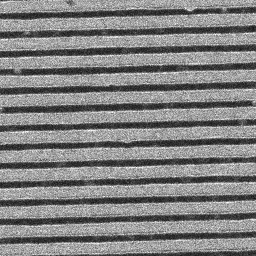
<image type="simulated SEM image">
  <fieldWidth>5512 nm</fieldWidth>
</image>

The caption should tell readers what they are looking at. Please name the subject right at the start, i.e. parallel lines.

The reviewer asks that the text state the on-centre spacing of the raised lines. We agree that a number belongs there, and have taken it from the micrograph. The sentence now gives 403 nanometers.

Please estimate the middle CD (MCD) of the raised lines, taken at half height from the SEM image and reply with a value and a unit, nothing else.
194 nanometres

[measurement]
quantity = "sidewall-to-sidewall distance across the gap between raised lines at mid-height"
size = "210 nm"